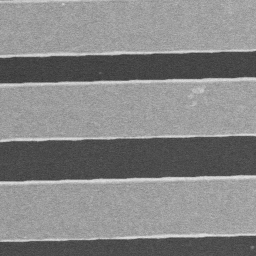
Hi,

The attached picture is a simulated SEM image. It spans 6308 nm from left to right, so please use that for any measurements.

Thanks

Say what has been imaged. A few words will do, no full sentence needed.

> lines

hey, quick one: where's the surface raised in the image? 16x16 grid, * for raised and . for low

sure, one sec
****************
****************
****************
**..............
................
****************
****************
****************
**************..
................
................
****************
****************
****************
****************
................